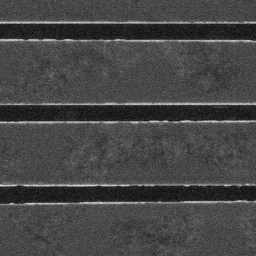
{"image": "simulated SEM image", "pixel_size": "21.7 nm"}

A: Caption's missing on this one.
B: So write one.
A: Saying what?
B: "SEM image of lines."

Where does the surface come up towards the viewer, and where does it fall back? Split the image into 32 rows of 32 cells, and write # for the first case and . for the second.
################################
################################
################################
................................
................................
################################
################################
################################
################################
################################
################################
################################
################################
................................
................................
################################
################################
################################
################################
################################
################################
################################
################################
................................
................................
...#############################
################################
################################
################################
################################
################################
################################